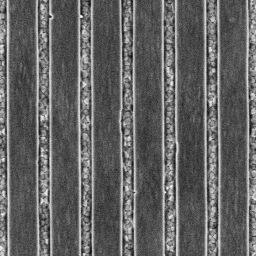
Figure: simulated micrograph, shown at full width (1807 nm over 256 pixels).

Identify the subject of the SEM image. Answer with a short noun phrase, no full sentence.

parallel lines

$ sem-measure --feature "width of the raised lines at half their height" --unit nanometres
215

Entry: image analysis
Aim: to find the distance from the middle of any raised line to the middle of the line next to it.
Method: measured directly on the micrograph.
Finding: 297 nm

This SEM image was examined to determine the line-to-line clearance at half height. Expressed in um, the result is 0.0803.